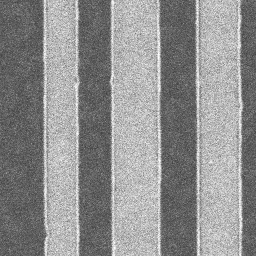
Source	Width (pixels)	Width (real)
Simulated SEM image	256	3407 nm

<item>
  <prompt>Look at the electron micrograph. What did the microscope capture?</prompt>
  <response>one or a few lines or trenches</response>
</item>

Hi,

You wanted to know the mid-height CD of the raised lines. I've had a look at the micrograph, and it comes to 514 nm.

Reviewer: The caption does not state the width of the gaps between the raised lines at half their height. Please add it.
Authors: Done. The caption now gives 538 nm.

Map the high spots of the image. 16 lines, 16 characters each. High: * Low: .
***..**...**...*
***..**...**...*
***..**...**...*
***..**...**...*
***..**...**...*
***..**...**...*
***..**...**...*
***..**...**...*
***..**...**...*
***..**...**...*
***..**...**...*
***..**...**...*
***..**...**...*
***..**...**...*
***..**...**...*
***..**...**...*